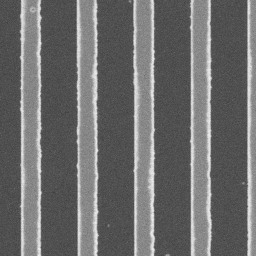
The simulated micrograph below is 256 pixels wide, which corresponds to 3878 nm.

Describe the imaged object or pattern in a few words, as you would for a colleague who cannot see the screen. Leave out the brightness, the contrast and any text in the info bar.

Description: lines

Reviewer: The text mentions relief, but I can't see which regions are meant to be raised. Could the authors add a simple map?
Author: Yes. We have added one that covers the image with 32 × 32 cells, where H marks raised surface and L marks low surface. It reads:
LLLHHLLLLLHHLLLLLHHLLLLLHHLLLLLH
LLLHHLLLLLHHLLLLLHHLLLLLHHLLLLLH
LLLHHLLLLLHHLLLLLHHLLLLLHHLLLLLH
LLLHHLLLLLHHLLLLLHHLLLLLHHLLLLLH
LLLHHLLLLLHHLLLLLHHLLLLLHHLLLLLH
LLLHHLLLLLHHLLLLLHHLLLLLHHLLLLLH
LLLHHLLLLLHHLLLLLHHLLLLLHHLLLLLH
LLLHHLLLLLHHLLLLLHHLLLLLHHLLLLLH
LLLHHLLLLLHHLLLLLHHLLLLLHHLLLLLH
LLLHHLLLLLHHLLLLLHHLLLLLHHLLLLLH
LLLHHLLLLLHHLLLLLHHLLLLLHHLLLLLH
LLLHHLLLLLHHLLLLLHHLLLLLHHLLLLLH
LLLHHLLLLLHHLLLLLHHLLLLLHHLLLLLH
LLLHHLLLLLHHLLLLLHHLLLLLHHLLLLLH
LLLHHLLLLLHHLLLLLHHLLLLLHHLLLLLH
LLLHHLLLLLHHLLLLLHHLLLLLHHLLLLLH
LLLHHLLLLLHHLLLLLHHLLLLLHHLLLLLH
LLLHHLLLLLHHLLLLLHHLLLLLHHLLLLLH
LLLHHLLLLLHHLLLLLHHLLLLLHHLLLLLH
LLLHHLLLLLHHLLLLLHHLLLLLHHLLLLLH
LLLHHLLLLLHHLLLLLHHLLLLLHHLLLLLH
LLLHHLLLLLHHLLLLLHHLLLLLHHLLLLLH
LLLHHLLLLLHHLLLLLHHLLLLLHHLLLLLH
LLLHHLLLLLHHLLLLLHHLLLLLHHLLLLLH
LLLHHLLLLLHHLLLLLHHLLLLLHHLLLLLH
LLLHHLLLLLHHLLLLLHHLLLLLHHLLLLLH
LLLHHLLLLLHHLLLLLHHLLLLLHHLLLLLH
LLLHHLLLLLHHLLLLLHHLLLLLHHLLLLLH
LLLHHLLLLLHHLLLLLHHLLLLLHHLLLLLH
LLLHHLLLLLHHLLLLLHHLLLLLHHLLLLLH
LLLHHLLLLLHHLLLLLHHLLLLLHHLLLLLH
LLLHHLLLLLHHLLLLLHHLLLLLHHLLLLLH